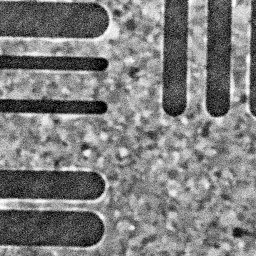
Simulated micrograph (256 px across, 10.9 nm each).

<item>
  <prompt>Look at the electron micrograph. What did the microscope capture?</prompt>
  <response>groups of lines, slits or small figures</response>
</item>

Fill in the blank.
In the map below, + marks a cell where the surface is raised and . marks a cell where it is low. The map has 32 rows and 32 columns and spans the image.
.............+++++++....++...++.
..............++++++....++...++.
..............++++++....++...++.
..............++++++....++...++.
.............+++++++....++...++.
++++++++++++++++++++....++...++.
++++++++++++++++++++....++...++.
.............+++++++....++...++.
.............+++++++....++...++.
++++++++++++++++++++....++...++.
++++++++++++++++++++....++...++.
++++++++++++++++++++....++...++.
...........+++++++++....++...++.
.............+++++++...+++...++.
++++++++..+++++++++++.++++..++++
++++++++++++++++++++++++++++++++
++++++++++++++++++++++++++++++++
++++++++++++++++++++++++++++++++
++++++++++++++++++++++++++++++++
++++++++++++++++++++++++++++++++
++++++++++++++++++++++++++++++++
............++++++++++++++++++++
.............+++++++++++++++++++
.............+++++++++++++++++++
.............+++++++++++++++++++
++++++++++++++++++++++++++++++++
............++++++++++++++++++++
.............+++++++++++++++++++
.............+++++++++++++++++++
.............+++++++++++++++++++
............++++++++++++++++++++
++++++++++++++++++++++++++++++++